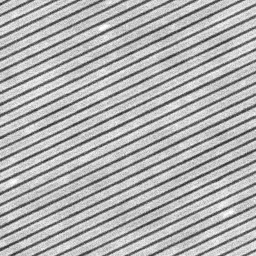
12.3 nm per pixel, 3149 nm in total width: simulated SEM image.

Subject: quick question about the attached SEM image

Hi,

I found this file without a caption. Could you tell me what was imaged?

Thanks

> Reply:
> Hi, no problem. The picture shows parallel lines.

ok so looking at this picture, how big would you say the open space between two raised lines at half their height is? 44.4 nanometres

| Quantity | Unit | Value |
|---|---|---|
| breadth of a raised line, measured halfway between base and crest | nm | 77.7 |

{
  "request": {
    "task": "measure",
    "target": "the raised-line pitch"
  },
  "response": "124 nm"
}